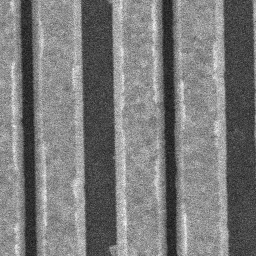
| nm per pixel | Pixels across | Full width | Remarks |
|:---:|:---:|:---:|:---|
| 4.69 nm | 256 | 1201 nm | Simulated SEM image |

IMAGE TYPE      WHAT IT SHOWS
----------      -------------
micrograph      one or a few lines or trenches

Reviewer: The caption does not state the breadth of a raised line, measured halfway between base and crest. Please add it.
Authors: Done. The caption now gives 196 nanometres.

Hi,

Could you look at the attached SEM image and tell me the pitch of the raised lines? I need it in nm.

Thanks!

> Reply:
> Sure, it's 331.